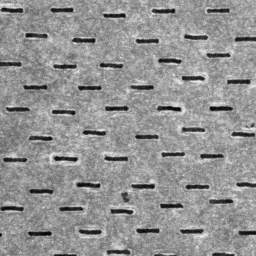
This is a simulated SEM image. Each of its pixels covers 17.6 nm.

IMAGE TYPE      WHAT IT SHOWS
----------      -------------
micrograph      a regular array of holes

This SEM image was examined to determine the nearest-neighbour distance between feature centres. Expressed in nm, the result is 536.